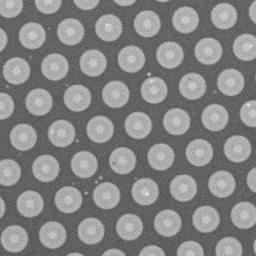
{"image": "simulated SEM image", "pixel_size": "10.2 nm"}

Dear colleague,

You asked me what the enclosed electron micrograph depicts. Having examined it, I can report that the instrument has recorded an array of small figures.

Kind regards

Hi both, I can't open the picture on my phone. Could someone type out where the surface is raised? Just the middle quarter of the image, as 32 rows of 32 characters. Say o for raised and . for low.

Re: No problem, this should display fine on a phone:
o...oooooo....oooooo.....ooo....
o...oooooo.....oooo.............
o....oooo......................o
......................o.......oo
............oo......ooooo....ooo
..ooo.....oooooo...ooooooo...ooo
.ooooo....oooooo...ooooooo...ooo
oooooo....oooooo...ooooooo...ooo
ooooooo...oooooo....ooooo......o
ooooooo...oooooo.....ooo........
.ooooo.....oooo.................
..ooo......................ooo..
.................ooo.....oooooo.
.......oooo.....ooooo....oooooo.
o.....oooooo...ooooooo...oooooo.
oo....oooooo...ooooooo...oooooo.
ooo...oooooo...ooooooo....ooooo.
ooo...oooooo....ooooo......ooo..
ooo...oooooo......oo............
oo......oo......................
o.....................oooo.....o
.............ooo.....oooooo....o
...oooo.....oooooo...oooooo....o
..oooooo...ooooooo...oooooo....o
..oooooo...ooooooo...oooooo....o
..oooooo....oooooo....ooooo.....
..oooooo....ooooo.......o.......
...oooo.........................
............................oooo
..................ooooo....ooooo
........ooooo....oooooo....ooooo
ooo.....oooooo...ooooooo...ooooo